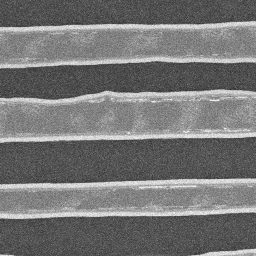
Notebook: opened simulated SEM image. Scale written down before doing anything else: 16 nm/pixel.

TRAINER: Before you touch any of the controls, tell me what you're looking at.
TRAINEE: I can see one or a few lines or trenches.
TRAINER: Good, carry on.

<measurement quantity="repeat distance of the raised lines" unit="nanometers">1230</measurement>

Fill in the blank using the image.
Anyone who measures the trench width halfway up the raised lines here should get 685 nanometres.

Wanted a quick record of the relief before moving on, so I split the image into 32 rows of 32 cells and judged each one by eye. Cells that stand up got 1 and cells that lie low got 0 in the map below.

00000000000000000000000000000000
00000000000000000000000000000000
00000000000000000000000000000000
00000000011111111111111111111111
11111111111111111111111111111111
11111111111111111111111111111111
11111111111111111111111111111111
11111111111111111100010001111100
00000000000000000000000000000000
00000000000000000000000000000000
00000000000000000000000000000000
00000000000000000000000000010000
01100000011111111111111111111111
11111111111111111111111111111111
11111111111111111111111111111111
11111111111111111111111111111111
11111111111111111111111111111111
00000000000000000000000000000000
00000000000000000000000000000000
00000000000000000000000000000000
00000000000000000000000000000000
00000000000000000000000000000000
00000000000000000000000000000000
11111111111111111111111111111111
11111111111111111111111111111111
11111111111111111111111111111111
11111111111111111111111101100000
00000000000000000000000000000000
00000000000000000000000000000000
00000000000000000000000000000000
00000000000000000000000000000000
00000000000000000000000000000011